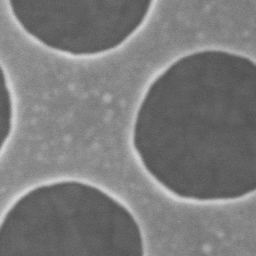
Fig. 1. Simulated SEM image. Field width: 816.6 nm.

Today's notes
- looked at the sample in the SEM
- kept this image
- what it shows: holes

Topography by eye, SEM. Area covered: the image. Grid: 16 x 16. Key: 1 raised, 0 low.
1000000001111111
1000000001111111
1100000011111111
1111111111110001
1111111111000000
0111111110000000
0111111110000000
0111111100000000
0111111100000000
1111111100000000
1111111110000000
1110011111000000
1000000111110011
0000000011111111
0000000001111111
0000000001111111